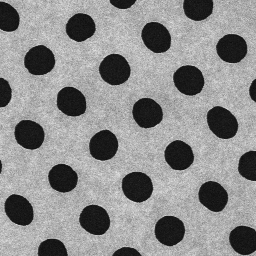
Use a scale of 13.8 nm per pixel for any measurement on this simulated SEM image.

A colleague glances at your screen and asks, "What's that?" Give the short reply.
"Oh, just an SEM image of a regular array of holes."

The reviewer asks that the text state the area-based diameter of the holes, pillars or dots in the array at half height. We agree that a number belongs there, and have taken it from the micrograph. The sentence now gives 415 nm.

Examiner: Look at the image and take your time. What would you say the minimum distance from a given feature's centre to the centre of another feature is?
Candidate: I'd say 723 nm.